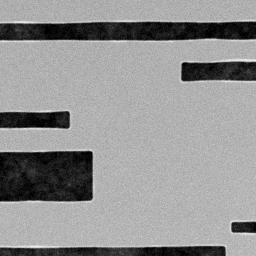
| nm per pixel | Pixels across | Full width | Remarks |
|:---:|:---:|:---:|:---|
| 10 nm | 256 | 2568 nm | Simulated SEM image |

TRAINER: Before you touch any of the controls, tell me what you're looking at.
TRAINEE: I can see groups of lines, slits or small figures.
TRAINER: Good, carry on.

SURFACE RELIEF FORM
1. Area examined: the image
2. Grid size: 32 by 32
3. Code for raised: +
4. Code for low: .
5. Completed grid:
++++++++++++++++++++++++++++++++
++++++++++++++++++++++++++++++++
++++++++++++++++++++++++++++++++
................................
................................
++++++++++++++++++++++++++++++++
++++++++++++++++++++++++++++++++
+++++++++++++++++++++++++++++...
+++++++++++++++++++++++.........
+++++++++++++++++++++++.........
++++++++++++++++++++++++++++++++
++++++++++++++++++++++++++++++++
++++++++++++++++++++++++++++++++
++++++++++++++++++++++++++++++++
.........+++++++++++++++++++++++
.........+++++++++++++++++++++++
++++++++++++++++++++++++++++++++
++++++++++++++++++++++++++++++++
++++++++++++++++++++++++++++++++
............++++++++++++++++++++
............++++++++++++++++++++
............++++++++++++++++++++
............++++++++++++++++++++
............++++++++++++++++++++
............++++++++++++++++++++
++++++++++++++++++++++++++++++++
++++++++++++++++++++++++++++++++
++++++++++++++++++++++++++++++++
+++++++++++++++++++++++++++++...
++++++++++++++++++++++++++++++++
++++++++++++++++++++++++++++++++
............................++++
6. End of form